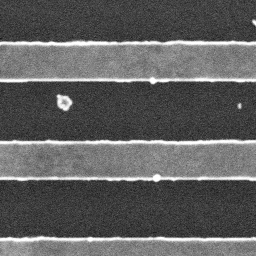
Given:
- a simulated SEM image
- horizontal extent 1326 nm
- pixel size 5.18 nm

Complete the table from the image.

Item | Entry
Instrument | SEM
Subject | lines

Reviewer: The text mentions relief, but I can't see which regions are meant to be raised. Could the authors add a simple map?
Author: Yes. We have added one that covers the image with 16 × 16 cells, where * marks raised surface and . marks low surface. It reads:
................
................
................
****************
****************
................
................
................
................
****************
****************
................
................
................
................
****************